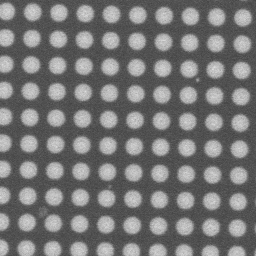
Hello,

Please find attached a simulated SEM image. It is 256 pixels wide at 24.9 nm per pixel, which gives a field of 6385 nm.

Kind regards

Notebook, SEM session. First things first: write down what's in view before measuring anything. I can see an array of small figures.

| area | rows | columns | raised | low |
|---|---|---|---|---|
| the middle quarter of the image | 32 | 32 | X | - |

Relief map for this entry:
---XXXX--XXXXX--XXXX---XXXX--XXX
---XXXX---XXX---XXXX---XXXX--XXX
----XX-----XX----XX----XXX----XX
--------------------------------
--------------------------------
---XXX----XX-----XX-------------
---XXXX--XXXX---XXXX---XXX---XXX
---XXXX--XXXX---XXXX--XXXXX--XXX
---XXX----XXX---XXXX---XXX---XXX
------------------------XX----XX
--------------------------------
--------------------------------
---XXX----XXX---XXX----XXX----XX
---XXXX--XXXX---XXXX--XXXX---XXX
---XXXX--XXXX---XXXX--XXXX---XXX
----XX----XX----XXX----XXX---XXX
--------------------------------
--------------------------------
---XXX----XX--------------------
--XXXX---XXXX---XXX----XXX---XXX
--XXXX---XXXX--XXXXX--XXXX---XXX
---XXX---XXXX---XXX---XXXX---XXX
-----------------X-----XXX---XXX
--------------------------------
--------------------------------
---XXX---XXX----XXX----XX-------
--XXXX---XXXX--XXXX---XXXX---XXX
--XXXX---XXXX--XXXX---XXXX---XXX
---XXX---XXX----XXX---XXXX---XXX
------------------------------X-
--------------------------------
---XX---------------------------